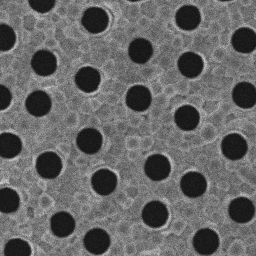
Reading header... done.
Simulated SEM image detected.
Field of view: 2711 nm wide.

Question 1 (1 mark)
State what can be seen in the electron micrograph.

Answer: a regular array of holes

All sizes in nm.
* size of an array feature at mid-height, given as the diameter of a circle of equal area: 282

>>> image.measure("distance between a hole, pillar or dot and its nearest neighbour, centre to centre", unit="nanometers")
496